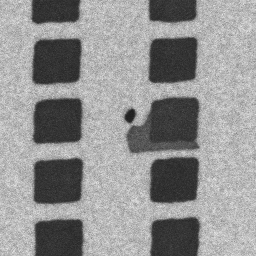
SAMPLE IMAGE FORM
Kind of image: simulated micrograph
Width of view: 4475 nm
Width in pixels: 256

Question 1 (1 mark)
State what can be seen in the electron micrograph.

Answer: holes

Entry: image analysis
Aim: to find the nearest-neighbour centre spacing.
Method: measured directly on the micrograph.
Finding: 1050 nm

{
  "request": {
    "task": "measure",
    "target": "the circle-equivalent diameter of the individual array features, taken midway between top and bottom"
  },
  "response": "51.5 px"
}